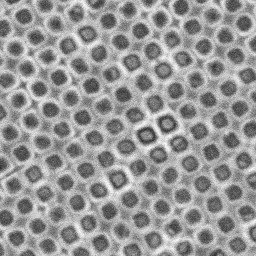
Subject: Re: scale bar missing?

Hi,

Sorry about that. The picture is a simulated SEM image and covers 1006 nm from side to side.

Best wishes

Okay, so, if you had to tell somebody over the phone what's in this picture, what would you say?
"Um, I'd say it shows a regular array of holes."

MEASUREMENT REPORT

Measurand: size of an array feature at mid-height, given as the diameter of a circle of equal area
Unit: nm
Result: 67.9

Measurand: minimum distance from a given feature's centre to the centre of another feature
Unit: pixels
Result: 23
